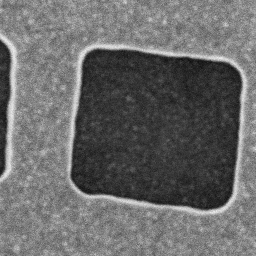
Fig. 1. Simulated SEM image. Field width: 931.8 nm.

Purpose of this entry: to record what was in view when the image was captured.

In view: holes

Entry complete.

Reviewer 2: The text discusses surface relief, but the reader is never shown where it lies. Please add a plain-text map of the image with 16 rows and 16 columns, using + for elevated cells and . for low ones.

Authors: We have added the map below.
++++++++++++++++
++++++++++++++++
++++++++++++++++
.++++.......++++
.++++..........+
.++++..........+
.++++..........+
.++++..........+
.++++..........+
++++...........+
++++...........+
+++++..........+
++++++++......++
++++++++++++++++
++++++++++++++++
++++++++++++++++